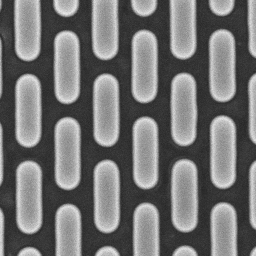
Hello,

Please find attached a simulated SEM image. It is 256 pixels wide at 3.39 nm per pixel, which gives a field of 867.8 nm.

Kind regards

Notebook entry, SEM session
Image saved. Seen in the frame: groups of lines, slits or small figures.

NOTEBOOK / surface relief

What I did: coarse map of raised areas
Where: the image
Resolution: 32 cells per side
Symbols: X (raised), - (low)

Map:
--XXX--XXX--XXX-XXXX-XXX--XXX--X
--XXX--XX---XXX--XX--XXX---XX--X
--XXX-------XXX------XXX-------X
--XXX-------XXX------XXX-------X
--XXX--XX---XXX--XX--XXX---XX--X
--XXX--XXX--XXX--XXX-XXX--XXX--X
--XXX--XXX--XXX--XXX--XX--XXX--X
---X---XXX-------XXX------XXX---
-------XXX-------XXX------XXX---
---X---XXX---X---XXX--XX--XXX---
--XXX--XXX--XXX--XXX--XX--XXX--X
--XXX--XXX--XXX--XXX--XX--XXX--X
--XXX---X---XXX--XX--XXX---X---X
--XXX-------XXX------XXX-------X
--XXX-------XXX-------XX-------X
--XXX--XXX--XXX--XX---XX---XX--X
--XXX--XXX--XXX--XXX--XX--XXX--X
--XXX--XXX--XXX--XXX--XX--XXX---
-------XXX-------XXX------XXX---
-------XXX-------XXX------XXX---
---X---XXX--XX---XXX--XX--XXX---
--XXX--XXX--XXX--XXX--XX--XXX--X
--XXX--XXX--XXX--XXX--XX---XX--X
--XXX---X---XXX---X---XXX------X
--XXX-------XXX-------XXX------X
--XXX-------XXX---X---XXX------X
--XXX--XXX--XXX--XXX--XXX--XX--X
--XXX--XXX--XXX--XXX--XXX-XXX--X
---XX--XXX--XX---XXX--XX---XX---
-------XXX-------XXX-------XX---
-------XXX-------XXX-------XX---
---XX--XXX--XXX--XXX--XX---XX---